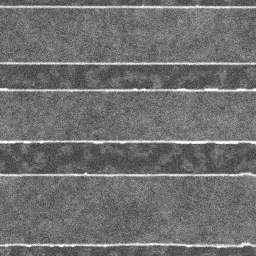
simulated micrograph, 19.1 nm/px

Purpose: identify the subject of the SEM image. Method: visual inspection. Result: one or a few lines or trenches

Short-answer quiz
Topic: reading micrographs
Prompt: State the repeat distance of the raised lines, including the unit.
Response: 1.67 um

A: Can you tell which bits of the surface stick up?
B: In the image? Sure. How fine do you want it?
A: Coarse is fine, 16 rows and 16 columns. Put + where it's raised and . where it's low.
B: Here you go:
++++++++++++++++
++++++++++++++++
++++++++++++++++
++++++++++++++++
................
................
++++++++++++++++
++++++++++++++++
++++++++++++++++
................
................
++++++++++++++++
++++++++++++++++
++++++++++++++++
++++++++++++++++
................